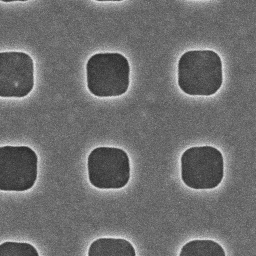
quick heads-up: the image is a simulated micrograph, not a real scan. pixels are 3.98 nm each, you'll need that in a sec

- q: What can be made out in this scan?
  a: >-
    holes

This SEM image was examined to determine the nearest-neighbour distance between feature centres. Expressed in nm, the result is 368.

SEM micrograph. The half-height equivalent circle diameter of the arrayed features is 0.181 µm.